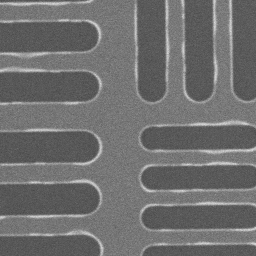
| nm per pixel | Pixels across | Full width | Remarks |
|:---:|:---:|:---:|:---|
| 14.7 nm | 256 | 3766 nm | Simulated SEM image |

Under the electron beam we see groups of lines, slits or small figures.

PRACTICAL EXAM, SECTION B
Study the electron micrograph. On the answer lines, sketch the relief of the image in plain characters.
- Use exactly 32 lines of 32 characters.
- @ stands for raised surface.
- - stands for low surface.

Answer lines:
@@-@@@@@@@@@@@@@@----@@----@@---
@@@@@@@@@@@@@@@@@----@@----@@---
@@@@@@@@@@@@@@@@@----@@----@@---
------------@@@@@----@@----@@---
------------@@@@@----@@----@@---
------------@@@@@----@@----@@---
-----------@@@@@@----@@----@@---
@@@@@@@@@@@@@@@@@----@@----@@---
@@@@@@@@@@@@@@@@@----@@----@@---
------------@@@@@----@@----@@---
------------@@@@@----@@----@@---
------------@@@@@----@@----@@---
-----------@@@@@@@--@@@@--@@@@--
@@@@@@@@@@@@@@@@@@@@@@@@@@@@@@@@
@@@@@@@@@@@@@@@@@@@@@@@@@@@@@@@@
@@@@@@@@@@@@@@@@@@@@@@@@@@@@---@
-----------@@@@@@@--------------
------------@@@@@@--------------
-------------@@@@@--------------
------------@@@@@@@@@@@@@@@@@@@@
---@@@@@@@@@@@@@@@@@@@@@@@-----@
@@@@@@@@@@@@@@@@@@--------------
@@@@@@@@@@@@@@@@@@--------------
------------@@@@@@--------------
-------------@@@@@@@@@@@@@@@@@@@
------------@@@@@@@@@@@@@------@
------------@@@@@@--------------
@@@@@@@@@@@@@@@@@@--------------
@@@@@@@@@@@@@@@@@@--------------
-----------@@@@@@@@@@@@@@@@@@@@@
------------@@@@@@@@@@@@@-@@@@-@
-------------@@@@@--------------